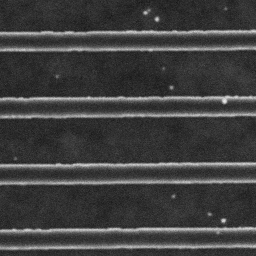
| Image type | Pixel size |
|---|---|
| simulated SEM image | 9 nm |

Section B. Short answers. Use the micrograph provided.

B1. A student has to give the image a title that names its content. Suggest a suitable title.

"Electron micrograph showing lines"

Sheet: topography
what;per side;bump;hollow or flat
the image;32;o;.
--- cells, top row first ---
................................
................................
................................
................................
oooooooooooooooooooooooooooooooo
oooooooooooooooooooooooooooooooo
................................
................................
................................
................................
................................
................................
oooooooooooooooooooooooooooooooo
oooooooooooooooooooooooooooooooo
oooooooooooo....................
................................
................................
................................
................................
................................
...................ooooooooooooo
oooooooooooooooooooooooooooooooo
oooooooooooooooooooooooooooooooo
................................
................................
................................
................................
................................
...........................ooooo
oooooooooooooooooooooooooooooooo
oooooooooooooooooooooooooooooooo
................................